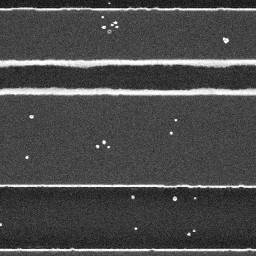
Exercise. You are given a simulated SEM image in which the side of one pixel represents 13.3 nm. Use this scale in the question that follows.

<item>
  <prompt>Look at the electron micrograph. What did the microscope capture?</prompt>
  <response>lines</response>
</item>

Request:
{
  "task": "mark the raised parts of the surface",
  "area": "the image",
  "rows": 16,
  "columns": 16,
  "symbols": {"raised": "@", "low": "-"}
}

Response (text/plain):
----------------
@@@@@@@@@@@@@@@@
@@@@@@@@@@@@@@@@
@@@@@@@@@@@@@@@@
----------------
----------------
@@@@@@@@@@@@@@@@
@@@@@@@@@@@@@@@@
@@@@@@@@@@@@@@@@
@@@@@@@@@@@@@@@@
@@@@@@@@@@@@@@@@
@@@@@@@@@@@@@@@@
----------------
----------------
----------------
----------------